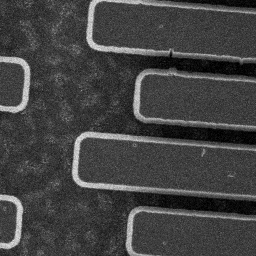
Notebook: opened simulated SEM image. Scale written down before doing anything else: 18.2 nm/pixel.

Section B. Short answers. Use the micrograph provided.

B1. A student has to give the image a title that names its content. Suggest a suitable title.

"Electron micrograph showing one or a few lines or trenches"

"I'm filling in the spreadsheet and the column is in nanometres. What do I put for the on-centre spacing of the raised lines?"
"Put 1260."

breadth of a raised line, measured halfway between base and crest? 920 nm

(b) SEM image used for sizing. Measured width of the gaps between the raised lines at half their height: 348 nm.